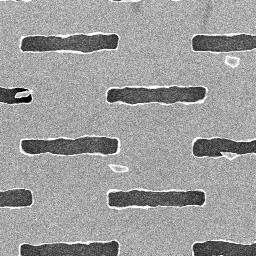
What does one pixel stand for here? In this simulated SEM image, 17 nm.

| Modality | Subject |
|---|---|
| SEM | holes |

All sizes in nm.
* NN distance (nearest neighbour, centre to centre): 1680